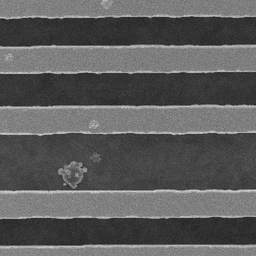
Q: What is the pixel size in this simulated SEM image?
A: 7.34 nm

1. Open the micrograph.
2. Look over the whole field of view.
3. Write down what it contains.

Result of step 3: lines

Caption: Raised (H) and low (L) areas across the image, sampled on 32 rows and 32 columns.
HHHHHHHHHHHHHHHHHHHHHHHHHHHHHHHH
HHHHHHHHHHHHHHHHHHHHHHHHHHHHHHHH
LLLLLLLLLLLLLLLLLLLLLLLLLLLLLLLL
LLLLLLLLLLLLLLLLLLLLLLLLLLLLLLLL
LLLLLLLLLLLLLLLLLLLLLLLLLLLLLLLL
LLLLLLLLLLLLLLLLLLLLLLLLLLLLLLLL
HHHHHHHHHHHHHHHHHHHHHHHHHHHHHHHH
HHHHHHHHHHHHHHHHHHHHHHHHHHHHHHHH
HHHHHHHHHHHHHHHHHHHHHHHHHHHHHHHH
LLLLLLLLLLLLLLLLLLLLLLLLLLLLLLLL
LLLLLLLLLLLLLLLLLLLLLLLLLLLLLLLL
LLLLLLLLLLLLLLLLLLLLLLLLLLLLLLLL
LLLLLLLLLLLLLLLLLLLLLLLLLLLLLLLL
HHHHHHHHHHHHHHHHHHHHHHHHHHHHHHHH
HHHHHHHHHHHHHHHHHHHHHHHHHHHHHHHH
HHHHHHHHHHHHHHHHHHHHHHHHHHHHHHHH
HHHHHHHHHHHHHHHHHHHHHHHHHHHHHHHH
LLLLLLLLLLLLLLLLLLLLLLLLLLLLLLLL
LLLLLLLLLLLLLLLLLLLLLLLLLLLLLLLL
LLLLLLLLLLLLLLLLLLLLLLLLLLLLLLLL
LLLLLLLLLLLLLLLLLLLLLLLLLLLLLLLL
LLLLLLLLLLLLLLLLLLLLLLLLLLLLLLLL
LLLLLLLLLLLLLLLLLLLLLLLLLLLLLLLL
LLLLLLLLLLLLLLLLLLLLLLLLLLLLLLLL
HHHHHHHHHHHHHHHHHHHHHHHHHHHHHHHH
HHHHHHHHHHHHHHHHHHHHHHHHHHHHHHHH
HHHHHHHHHHHHHHHHHHHHHHHHHHHHHHHH
LLLLLLLLLLLLLLLLLLLLLLLLLLLLLLLL
LLLLLLLLLLLLLLLLLLLLLLLLLLLLLLLL
LLLLLLLLLLLLLLLLLLLLLLLLLLLLLLLL
LLLLLLLLLLLLLLLLLLLLLLLLLLLLLLLL
HHHHHHHHHHHHHHHHHHHHHHHHHHHHHHHH